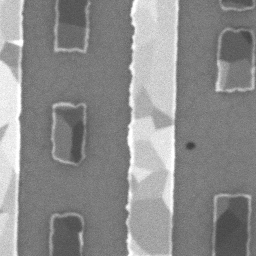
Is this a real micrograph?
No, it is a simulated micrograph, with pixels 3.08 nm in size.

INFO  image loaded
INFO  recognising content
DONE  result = one or a few lines or trenches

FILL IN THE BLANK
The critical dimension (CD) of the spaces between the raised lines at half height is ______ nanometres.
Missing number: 132